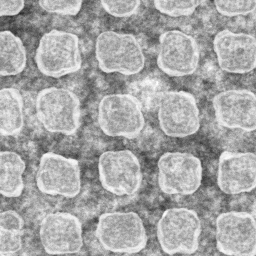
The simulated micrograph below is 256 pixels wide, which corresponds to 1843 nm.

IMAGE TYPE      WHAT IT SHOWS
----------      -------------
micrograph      a regular array of raised bodies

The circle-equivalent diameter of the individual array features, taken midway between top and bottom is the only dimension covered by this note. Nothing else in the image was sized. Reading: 0.304 microns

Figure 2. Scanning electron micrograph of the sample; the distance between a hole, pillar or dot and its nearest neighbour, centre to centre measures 415 nanometres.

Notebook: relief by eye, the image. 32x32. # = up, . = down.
###..#####...####...####...#####
##....#.......##............###.
................................
................................
##....###...####....###....####.
##...#####..#####...####...#####
###..#####..######..#####..#####
###..#####..######..#####..#####
###..####....#####...###....####
................................
................................
##....###............#......###.
##...####....####...####...#####
###..#####..#####...#####..#####
###..####....#####..#####..#####
###...####...#####..#####...####
##...........####....###........
................................
................................
##....#......####....##.....####
###..####...#####...#####..#####
###..#####...####...#####...####
###..#####...####...#####..#####
##...#####....###....####...###.
................................
................................
.....................###........
##....###....#####..#####..#####
###..#####..######..#####..#####
##...#####..######..#####..#####
###..#####...#####..#####..#####
##....###............#......####